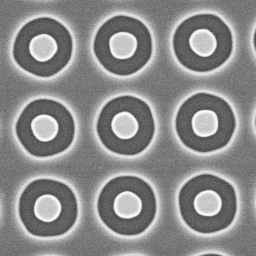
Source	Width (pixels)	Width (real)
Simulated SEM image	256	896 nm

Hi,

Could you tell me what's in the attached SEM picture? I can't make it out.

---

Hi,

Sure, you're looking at an array of small figures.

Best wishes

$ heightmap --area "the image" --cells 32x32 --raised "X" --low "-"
XXXXXXXXXXXXXXXXXXXXXXXXXXXXXXXX
XXXXXXXXXXXXXXXXXXXXXXXXXXXXXXXX
XXXX---XXXXXX-----XXXXX-----XXXX
XXX-----XXXX------XXXX-------XXX
XX---X---XXX--XX---XXX--XXX--XXX
XX--XXX--XXX--XXX--XX---XXX--XXX
XX--XXX--XXX--XXX--XXX---X---XXX
XX-------XXX-------XXX-------XXX
XXX-----XXXXX-----XXXXX----XXXXX
XXXX---XXXXXXXX-XXXXXXXXXXXXXXXX
XXXXXXXXXXXXXXXXXXXXXXXXXXXXXXXX
XXXXXXXXXXXXXXXXXXXXXXXXX-XXXXXX
XXXX---XXXXXXX----XXXXX-----XXXX
XXX-----XXXXX------XXX-------XXX
XX-------XXX---X---XXX--XXX--XXX
XX--XXX--XXX--XXX--XXX--XXX---XX
XX--XXX--XXX--XXX--XXX---XX--XXX
XX---X---XXX-------XXX-------XXX
XXX------XXXX-----XXXXX-----XXXX
XXXX---XXXXXXXX-XXXXXXXXXXXXXXXX
XXXXXXXXXXXXXXXXXXXXXXXXXXXXXXXX
XXXXXXXXXXXXXXXXXXXXXXXXXXXXXXXX
XXXX---XXXXXXX----XXXXX-----XXXX
XXX------XXXX------XXXX------XXX
XX---X---XXX---XX---XX---XX---XX
XX--XXX---XX--XXX---XX--XXXX--XX
XX--XXX---XX---XX---XX---XX---XX
XX---X----XXX------XXXX------XXX
XXX------XXXX------XXXXX----XXXX
XXXX----XXXXXXX--XXXXXXXXXXXXXXX
XXXXXXXXXXXXXXXXXXXXXXXXXXXXXXXX
XXXXXXXXXXXXXXXXXXXXXXXXXXXXXXXX